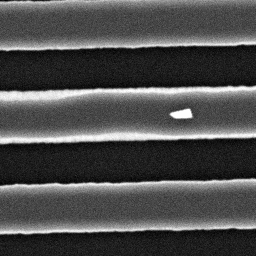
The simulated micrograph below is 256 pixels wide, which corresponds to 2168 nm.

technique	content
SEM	lines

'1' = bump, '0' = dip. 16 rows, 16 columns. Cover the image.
1111111111111111
1111111111111111
1111111111111111
0000000000000000
0000000000000000
0000000000000001
1111111111111111
1111111111111111
1111111111111111
0000000000000000
0000000000000000
0000011111111111
1111111111111111
1111111111111111
1110000000000000
0000000000000000